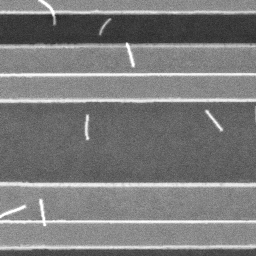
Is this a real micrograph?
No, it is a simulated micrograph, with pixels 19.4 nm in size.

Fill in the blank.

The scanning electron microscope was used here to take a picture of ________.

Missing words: lines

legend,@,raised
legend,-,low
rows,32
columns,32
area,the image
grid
@@@@@@@@@@@@@@@@@@@@@@@@@@@@@@@@
@@@@@@@@@@@@@@@@@@@@@@@@@@@@@@--
--------------------------------
--------------------------------
--------------------------------
--------------------------------
@@@@@@@@@@@@@@@@@@@@@@@@@@@@@@@@
@@@@@@@@@@@@@@@@@@@@@@@@@@@@@@@@
@@@@@@@@@@@@@@@@@@@@@@@@@@@@@@@@
@@@@@@@@@@@@@@@@@@@@@@@@@@@@@@@@
@@@@@@@@@@@@@@@@@@@@@@@@@@@@@@@@
@@@@@@@@@@@@@@@@@@@@@@@@@@@@@@@@
@@@@@@@@@@@@@@@@@@@@@@@@@@@@@@@@
--------------------------------
--------------------------------
--------------------------------
--------------------------------
--------------------------------
--------------------------------
--------------------------------
--------------------------------
--------------------------------
--------------------------------
@@@@@@@@@@@@@@@@@@@@@@@@@@@@@@@@
@@@@@@@@@@@@@@@@@@@@@@@@@@@@@@@@
@@@@@@@@@@@@@@@@@@@@@@@@@@@@@@@@
@@@@@@@@@@@@@@@@@@@@@@@@@@@@@@@@
@@@@@@@@@@@@@@@@@@@@@@@@@@@@@@@@
@@@@@@@@@@@@@@@@@@@@@@@@@@@@@@@@
@@@@@@@@@@@@@@@@@@@@@@@@@@@@@@@@
@@@@@@@@@@@@@@@@@@@@@@@@@@@@@@@@
--------------------------------